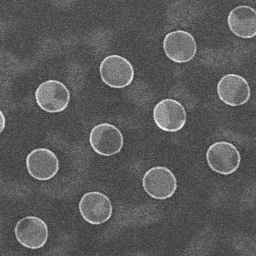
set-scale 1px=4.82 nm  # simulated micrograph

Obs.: a regular array of raised bodies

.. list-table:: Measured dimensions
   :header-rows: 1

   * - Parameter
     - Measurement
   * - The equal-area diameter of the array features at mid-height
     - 153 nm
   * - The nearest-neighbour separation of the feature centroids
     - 0.33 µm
